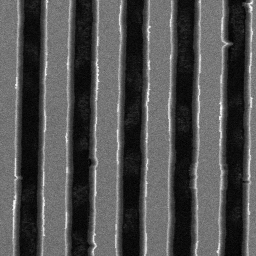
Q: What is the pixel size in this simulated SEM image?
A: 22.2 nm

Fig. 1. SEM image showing parallel lines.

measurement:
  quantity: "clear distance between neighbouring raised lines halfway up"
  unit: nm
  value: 516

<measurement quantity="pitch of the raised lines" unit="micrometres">1.14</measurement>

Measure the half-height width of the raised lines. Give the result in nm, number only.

624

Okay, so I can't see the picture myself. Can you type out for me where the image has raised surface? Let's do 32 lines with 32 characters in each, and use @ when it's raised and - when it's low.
@@@---@@@---@@@---@@@@---@@@---@
@@@--@@@@---@@@---@@@@---@@@---@
@@@--@@@@---@@@---@@@@---@@@---@
@@@--@@@@---@@@---@@@@---@@@---@
@@@---@@@---@@@---@@@@---@@@---@
@@@--@@@@---@@@---@@@@---@@@---@
@@----@@@---@@@---@@@@---@@@---@
@@---@@@@---@@@---@@@@---@@@---@
@@---@@@@---@@@---@@@@---@@@---@
@@---@@@@---@@@---@@@@---@@@---@
@@---@@@@---@@@---@@@@---@@@---@
@@---@@@@---@@@---@@@@--@@@@---@
@@---@@@@---@@@---@@@@--@@@@---@
@@---@@@@---@@@---@@@---@@@@---@
@@---@@@@---@@@---@@@---@@@@---@
@@---@@@@---@@@---@@@@--@@@@---@
@@---@@@@---@@@---@@@@---@@@---@
@@---@@@@---@@@---@@@----@@@---@
@@---@@@@---@@@---@@@---@@@@---@
@@---@@@@---@@@---@@@@--@@@@---@
@@---@@@@---@@@---@@@@--@@@@---@
@@---@@@@---@@@---@@@---@@@@---@
@@---@@@@---@@@---@@@---@@@@---@
@@---@@@@---@@@---@@@---@@@@---@
@@---@@@@---@@@---@@@---@@@@---@
@@---@@@@---@@@---@@@---@@@@---@
@@---@@@@---@@@---@@@---@@@@---@
@@---@@@@---@@@---@@@---@@@@---@
@@---@@@---@@@@---@@@---@@@@---@
@@---@@@---@@@@---@@@---@@@@---@
@@---@@@@--@@@@---@@@---@@@@---@
@@---@@@@--@@@@---@@@---@@@@---@